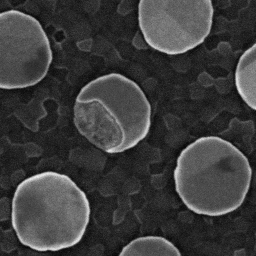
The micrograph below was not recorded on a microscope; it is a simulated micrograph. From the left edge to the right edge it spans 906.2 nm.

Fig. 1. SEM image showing raised bodies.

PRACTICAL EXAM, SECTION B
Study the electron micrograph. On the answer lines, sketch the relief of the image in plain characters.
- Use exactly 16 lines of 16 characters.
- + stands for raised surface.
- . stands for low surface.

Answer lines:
.........++++...
++.......++++...
+++......++++...
+++............+
+++............+
.....++++......+
......+++.......
.......++.......
........+.......
...........++++.
...........+++++
.++++......+++++
.++++......++++.
.++++...........
.++++...........
..++....+++.....